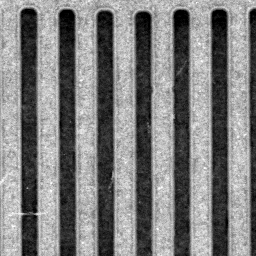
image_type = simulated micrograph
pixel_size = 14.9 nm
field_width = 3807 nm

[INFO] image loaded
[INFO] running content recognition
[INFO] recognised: parallel lines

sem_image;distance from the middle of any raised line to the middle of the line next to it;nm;567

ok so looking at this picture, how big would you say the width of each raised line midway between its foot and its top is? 0.307 µm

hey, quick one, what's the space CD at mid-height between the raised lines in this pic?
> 264 nm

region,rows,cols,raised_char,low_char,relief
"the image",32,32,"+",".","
++++++++++++++++++++++++++++++++
++...++..+++..+++.++++..++..+++.
++...++...++..+++..+++..++...++.
++...++...++..+++..+++..++...++.
++...++...++..+++..+++..++...++.
+++..++...++..+++..+++..++...++.
+++..++...++..+++..+++..++...++.
+++..++...++..+++..+++..++...++.
+++..++...++..+++..+++..++...++.
+++..++...++..+++..+++..++...++.
+++..++...++..+++..+++..++...++.
+++..++...++..+++..++...++...++.
+++..++...++..+++..+++..++...++.
+++..++...++..+++..+++..++...++.
+++..++...++..+++..+++..++...++.
+++..++...++..+++..+++..++...++.
+++..++...++..+++..+++..++...++.
+++..++...++..+++..+++..++...++.
+++..++...++..+++..+++..++...++.
+++..++...++..+++..+++..++...++.
+++..++...++..+++..+++..++...++.
+++..++...++..+++..+++..++...++.
+++..++...++..+++..+++..++...++.
+++..++...++..+++..+++..++...++.
+++..++...++..+++..+++..++...++.
+++..++...++..+++..+++..++...++.
+++..++...++..+++..+++..++...++.
+++..++...++..+++..+++..++...++.
+++..++...++..+++..+++..++...++.
+++..++...++..+++..+++..++...++.
+++..++...++..+++..+++..++...++.
+++..++...++..+++..+++..++...++.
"